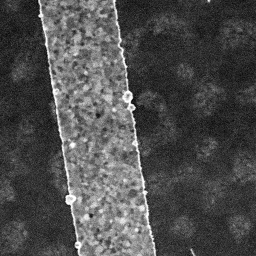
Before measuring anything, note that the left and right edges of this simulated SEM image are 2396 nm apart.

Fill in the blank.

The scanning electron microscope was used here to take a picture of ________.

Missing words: one or a few lines or trenches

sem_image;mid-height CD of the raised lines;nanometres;695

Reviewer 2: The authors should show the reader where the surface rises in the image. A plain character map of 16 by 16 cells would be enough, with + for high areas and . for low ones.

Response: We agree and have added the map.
..+++++.........
...++++.........
...++++.........
...+++++........
...+++++........
...+++++........
...+++++........
....++++........
....++++........
....+++++.......
....+++++.......
....+++++.......
....+++++.......
.....++++.......
.....++++.......
.....+++++......